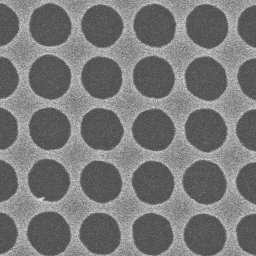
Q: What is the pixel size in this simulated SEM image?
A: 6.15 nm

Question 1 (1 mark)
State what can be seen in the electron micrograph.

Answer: a regular array of holes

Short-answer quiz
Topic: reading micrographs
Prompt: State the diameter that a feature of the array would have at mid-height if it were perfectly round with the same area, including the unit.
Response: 265 nm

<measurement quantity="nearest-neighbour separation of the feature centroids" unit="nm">317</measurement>